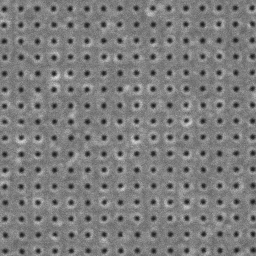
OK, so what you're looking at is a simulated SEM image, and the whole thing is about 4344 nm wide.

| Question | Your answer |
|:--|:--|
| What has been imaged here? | a regular array of holes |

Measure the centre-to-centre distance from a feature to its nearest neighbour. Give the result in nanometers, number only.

271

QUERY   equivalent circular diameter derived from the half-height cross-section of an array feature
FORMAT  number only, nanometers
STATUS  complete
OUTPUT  107